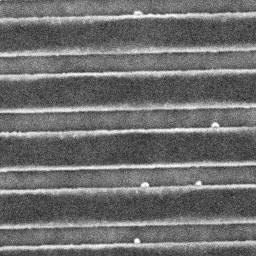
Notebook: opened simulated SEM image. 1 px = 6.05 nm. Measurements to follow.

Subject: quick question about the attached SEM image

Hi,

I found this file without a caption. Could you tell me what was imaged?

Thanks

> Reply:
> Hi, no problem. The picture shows lines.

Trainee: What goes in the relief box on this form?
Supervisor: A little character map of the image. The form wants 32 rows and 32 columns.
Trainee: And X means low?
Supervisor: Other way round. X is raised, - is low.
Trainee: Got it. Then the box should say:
--------------------------------
--------------------------------
--------XXXXXXXXXXXXXXXXXXXXXXXX
XXXXXXXXXXXXXXXXXXXXXXXXXXXXXXXX
XXXXXXXXXXXXXXXXXXXXXXXXXXXXXXXX
XXXXXXXXXXXXXXXXXXXXXXXXXXXXXXXX
XXXXXXXXXXX---------------------
--------------------------------
--------------------------------
-----XXXXXXXXXXXXXXXXXXXXXXXXXXX
XXXXXXXXXXXXXXXXXXXXXXXXXXXXXXXX
XXXXXXXXXXXXXXXXXXXXXXXXXXXXXXXX
XXXXXXXXXXXXXXXXXXXXXXXXXXXXXXXX
XXXXXXXXXXXXXXX-----------------
--------------------------------
--------------------------------
------------XXXXXXXXXXXXXXXXXXXX
XXXXXXXXXXXXXXXXXXXXXXXXXXXXXXXX
XXXXXXXXXXXXXXXXXXXXXXXXXXXXXXXX
XXXXXXXXXXXXXXXXXXXXXXXXXXXXXXXX
XXXXXXXXXXXXXXXXXXXXXXXXXXXXXXX-
--------------------------------
--------------------------------
-----------------------XXXXXXXXX
XXXXXXXXXXXXXXXXXXXXXXXXXXXXXXXX
XXXXXXXXXXXXXXXXXXXXXXXXXXXXXXXX
XXXXXXXXXXXXXXXXXXXXXXXXXXXXXXXX
XXXXXXXXXXXXXXXXXXXXXXXXXXXXXXXX
--------------------------------
--------------------------------
--------------------------XXXXXX
XXXXXXXXXXXXXXXXXXXXXXXXXXXXXXXX